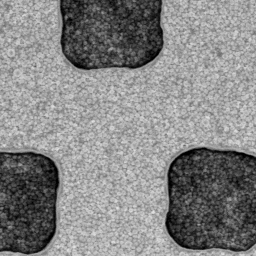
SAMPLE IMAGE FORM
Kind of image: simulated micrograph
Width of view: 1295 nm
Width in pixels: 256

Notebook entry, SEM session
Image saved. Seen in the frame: holes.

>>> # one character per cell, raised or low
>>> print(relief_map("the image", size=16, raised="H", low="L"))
HHHHLLLLLLHHHHHH
HHHHLLLLLLHHHHHH
HHHHLLLLLLHHHHHH
HHHHLLLLLLHHHHHH
HHHHHHHHHHHHHHHH
HHHHHHHHHHHHHHHH
HHHHHHHHHHHHHHHH
HHHHHHHHHHHHHHHH
HHHHHHHHHHHHHHHH
LLHHHHHHHHHHLLLH
LLLLHHHHHHHLLLLL
LLLLHHHHHHLLLLLL
LLLLHHHHHHHLLLLL
LLLLHHHHHHLLLLLL
LLLHHHHHHHHLLLLL
LLLHHHHHHHHHLLLL